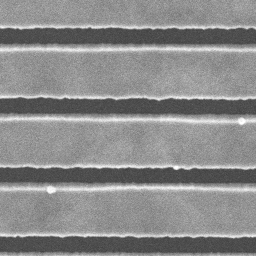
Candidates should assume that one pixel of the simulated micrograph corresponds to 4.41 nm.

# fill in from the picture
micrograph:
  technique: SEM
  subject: lines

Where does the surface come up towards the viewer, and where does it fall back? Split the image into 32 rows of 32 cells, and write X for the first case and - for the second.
XXXXXXXXXXXXXXXXXXXXXXXXXXXXXXXX
XXXXXXXXXXXXXXXXXXXXXXXXXXXXXXXX
XXXXXXXXXXXXXXXXXXXXXXXXXXXXXXXX
XXXXXXXXXXXXXX-XXXXXXXXXXXXXXXXX
--------------------------------
--------------------------------
XXXXXXXXXXXXXXXXXXXXXXXXXXXXXXXX
XXXXXXXXXXXXXXXXXXXXXXXXXXXXXXXX
XXXXXXXXXXXXXXXXXXXXXXXXXXXXXXXX
XXXXXXXXXXXXXXXXXXXXXXXXXXXXXXXX
XXXXXXXXXXXXXXXXXXXXXXXXXXXXXXXX
XXXXXXXXXXXXXXXXXXXXXXXXXXXXXXXX
--------------------------------
--------------------------------
--------------------------------
XXXXXXXXXXXXXXXXXXXXXXXXXXXXXXXX
XXXXXXXXXXXXXXXXXXXXXXXXXXXXXXXX
XXXXXXXXXXXXXXXXXXXXXXXXXXXXXXXX
XXXXXXXXXXXXXXXXXXXXXXXXXXXXXXXX
XXXXXXXXXXXXXXXXXXXXXXXXXXXXXXXX
XXXXXXXXXXXXXXXXXXXXXXXXXXXXXXXX
--------------------------------
--------------------------------
XXXXXXXXXXXXXXXXXXXXXXXXXXXXXXXX
XXXXXXXXXXXXXXXXXXXXXXXXXXXXXXXX
XXXXXXXXXXXXXXXXXXXXXXXXXXXXXXXX
XXXXXXXXXXXXXXXXXXXXXXXXXXXXXXXX
XXXXXXXXXXXXXXXXXXXXXXXXXXXXXXXX
XXXXXXXXXXXXXXXXXXXXXXXXXXXXXXXX
XXX----X--X--XXXXXXXXXXXXXXXXXXX
--------------------------------
--------------------------------